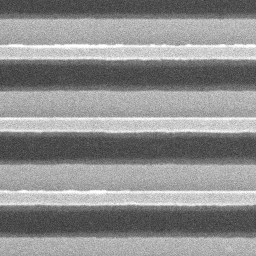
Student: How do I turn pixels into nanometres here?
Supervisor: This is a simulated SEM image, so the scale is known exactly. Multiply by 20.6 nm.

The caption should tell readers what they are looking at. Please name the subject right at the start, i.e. lines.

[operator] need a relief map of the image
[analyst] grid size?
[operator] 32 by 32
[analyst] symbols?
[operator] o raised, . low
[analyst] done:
................................
................................
oooooooooooooooooooooooooooooooo
oooooooooooooooooooooooooooooooo
oooooooooooooooooooooooooooooooo
oooooooooooooooooooooooooooooooo
oooooooooooooooooooooooooooooooo
................................
................................
................................
................................
oooooooooooooooooooooooooooooooo
oooooooooooooooooooooooooooooooo
oooooooooooooooooooooooooooooooo
oooooooooooooooooooooooooooooooo
oooooooooooooooooooooooooooooooo
.ooooo...ooo.oooooooooo.oooooooo
................................
................................
................................
................................
oooooooooooooooooooooooooooooooo
oooooooooooooooooooooooooooooooo
oooooooooooooooooooooooooooooooo
oooooooooooooooooooooooooooooooo
oooooooooooooooooooooooooooooooo
................................
................................
................................
................................
oooooooooooooooooooooooooooooooo
oooooooooooooooooooooooooooooooo